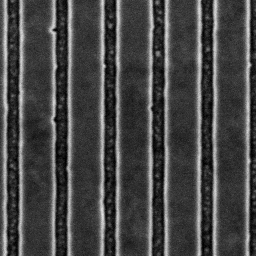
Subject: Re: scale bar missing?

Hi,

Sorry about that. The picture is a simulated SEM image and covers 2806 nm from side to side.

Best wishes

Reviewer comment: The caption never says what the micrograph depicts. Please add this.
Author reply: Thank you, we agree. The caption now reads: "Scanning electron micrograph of parallel lines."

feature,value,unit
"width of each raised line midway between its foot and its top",385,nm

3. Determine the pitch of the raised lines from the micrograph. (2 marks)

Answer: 531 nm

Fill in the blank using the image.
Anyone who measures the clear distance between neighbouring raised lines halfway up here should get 145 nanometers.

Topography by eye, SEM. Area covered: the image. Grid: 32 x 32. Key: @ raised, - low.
@--@@@@--@@@@--@@@@--@@@@--@@@@-
@--@@@@--@@@@--@@@@--@@@@--@@@@-
@--@@@@--@@@@--@@@@--@@@@--@@@@-
@--@@@@--@@@@--@@@@--@@@@--@@@@-
@--@@@@--@@@@--@@@@--@@@@--@@@@-
@--@@@@--@@@@--@@@@--@@@@--@@@@-
@--@@@@--@@@@--@@@@--@@@@--@@@@-
@--@@@@--@@@@--@@@@--@@@@--@@@@-
@--@@@@--@@@@--@@@@--@@@@--@@@@-
@--@@@@--@@@@--@@@@--@@@@--@@@@-
@-@@@@@--@@@@--@@@@--@@@@--@@@@-
@--@@@@--@@@@--@@@@--@@@@--@@@@-
@--@@@@--@@@@--@@@@--@@@@--@@@@-
@-@@@@@--@@@@--@@@@--@@@@--@@@@-
@--@@@@--@@@@--@@@@--@@@@--@@@@-
@--@@@@--@@@@--@@@@--@@@@--@@@@-
@--@@@@--@@@@--@@@@--@@@@--@@@@-
@--@@@@--@@@@--@@@@--@@@@--@@@@-
@--@@@@--@@@@--@@@@--@@@@--@@@@-
@--@@@@--@@@@--@@@@--@@@@--@@@@-
@-@@@@@-@@@@@--@@@@--@@@@--@@@@-
@--@@@@--@@@@--@@@@--@@@@--@@@@-
@--@@@@--@@@@--@@@@--@@@@--@@@@-
@--@@@@--@@@@--@@@@--@@@@--@@@@-
@--@@@@--@@@@--@@@@--@@@@--@@@@-
@--@@@@--@@@@--@@@@--@@@@--@@@@-
@--@@@@--@@@@--@@@@--@@@@--@@@@-
@--@@@@--@@@@--@@@@--@@@@--@@@@-
@-@@@@@--@@@@--@@@@--@@@@--@@@@-
@--@@@@--@@@@--@@@@--@@@@--@@@@-
@--@@@@--@@@@--@@@@--@@@@--@@@@-
@-@@@@@--@@@@--@@@@--@@@@--@@@@-